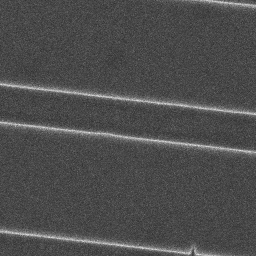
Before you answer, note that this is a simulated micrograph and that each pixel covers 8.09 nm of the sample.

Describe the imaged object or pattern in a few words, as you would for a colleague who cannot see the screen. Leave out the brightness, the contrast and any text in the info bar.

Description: one or a few lines or trenches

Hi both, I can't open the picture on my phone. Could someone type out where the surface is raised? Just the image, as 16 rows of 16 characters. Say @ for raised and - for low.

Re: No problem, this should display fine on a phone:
@@@@@@@@@@@@@@@@
@@@@@@@@@@@@@@@@
@@@@@@@@@@@@@@@@
@@@@@@@@@@@@@@@@
@@@@@@@@@@@@@@@@
--@@@@@@@@@@@@@@
----------@@@@@@
----------------
@@@@@@@---------
@@@@@@@@@@@@@@@@
@@@@@@@@@@@@@@@@
@@@@@@@@@@@@@@@@
@@@@@@@@@@@@@@@@
@@@@@@@@@@@@@@@@
@@@@@@@@@@@@@@@@
---------@@@@@@@